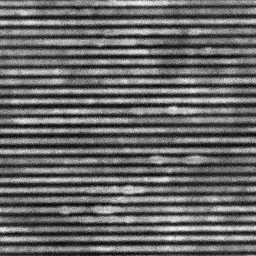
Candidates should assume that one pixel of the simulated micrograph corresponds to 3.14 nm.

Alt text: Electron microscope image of parallel lines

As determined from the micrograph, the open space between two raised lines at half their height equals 5.89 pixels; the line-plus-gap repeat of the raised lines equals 0.0309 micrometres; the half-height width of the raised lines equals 0.0126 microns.